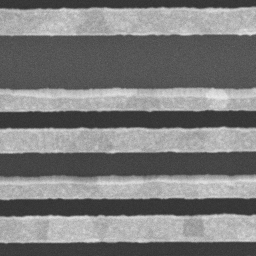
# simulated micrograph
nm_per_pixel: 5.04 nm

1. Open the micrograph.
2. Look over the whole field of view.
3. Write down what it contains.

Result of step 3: lines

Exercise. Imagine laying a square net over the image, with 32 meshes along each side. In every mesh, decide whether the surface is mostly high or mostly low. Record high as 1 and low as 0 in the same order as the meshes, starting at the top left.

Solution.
00000000000000000000000000000000
11111111111111111111111111111111
11111111111111111111111111111111
11111111111111111111111111111111
00000000000000000000000000000000
00000000000000000000000000000000
00000000000000000000000000000000
00000000000000000000000000000000
00000000000000000000000000000000
00000000000000000000000000000000
00000000000000000000000000000000
11000000000000110000000000000000
11111111111111111111111111111111
11111111111111111111111111111111
00000000000000000000000000000000
00000000000000000000000000000000
11111111111111111111111111111111
11111111111111111111111111111111
11111111111111111111111111111111
00000000000000000000000000000000
00000000000000000000000000000000
00000000000000000000000000000000
10100111110011111111111111111111
11111111111111111111111111111111
11111111111111111111111111111111
00000000000000000000000000000000
00000000000000000000000000000000
11111111111111111111111111111111
11111111111111111111111111111111
11111111111111111111111111111111
00000000000000000000000000000000
00000000000000000000000000000000